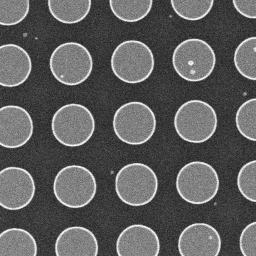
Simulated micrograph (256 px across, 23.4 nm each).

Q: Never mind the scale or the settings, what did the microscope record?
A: an array of small figures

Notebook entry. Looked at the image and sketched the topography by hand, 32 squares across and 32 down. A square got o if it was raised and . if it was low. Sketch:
oooo..ooooo...ooooo...ooooo..ooo
ooo...ooooo...ooooo...oooo....oo
ooo....ooo.....oo...............
................................
................................
........oo.....ooo.....ooo....oo
ooo....oooo...ooooo...ooooo..ooo
oooo..ooooo...ooooo...ooooo..ooo
oooo..ooooo...ooooo...ooooo...oo
oooo...oooo....oooo....ooo.....o
oo......oo......................
................................
...............................o
ooo.....ooo....oooo....ooo....oo
oooo...oooo...ooooo...ooooo...oo
oooo...ooooo..ooooo...ooooo...oo
oooo...ooooo..ooooo...ooooo...oo
ooo....oooo....ooo.....ooo......
................................
................................
................oo.....ooo.....o
ooo.....ooo....oooo...ooooo...oo
oooo...ooooo...ooooo..ooooo...oo
oooo...ooooo...ooooo..ooooo...oo
oooo...ooooo...oooo....oooo....o
ooo.....ooo.....oo..............
................................
................................
.........o......ooo....oooo....o
oooo...ooooo...ooooo...oooo...oo
ooooo..ooooo...ooooo..oooooo..oo
ooooo..ooooo...ooooo..ooooo...oo